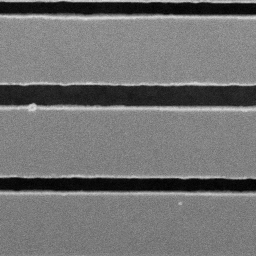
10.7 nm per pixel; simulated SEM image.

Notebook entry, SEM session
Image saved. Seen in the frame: lines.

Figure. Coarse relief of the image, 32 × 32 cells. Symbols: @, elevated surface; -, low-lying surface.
--------------------------------
--------------------------------
@@@@@@@@@@@@@@@@@@@@@@@@@@@@@@@@
@@@@@@@@@@@@@@@@@@@@@@@@@@@@@@@@
@@@@@@@@@@@@@@@@@@@@@@@@@@@@@@@@
@@@@@@@@@@@@@@@@@@@@@@@@@@@@@@@@
@@@@@@@@@@@@@@@@@@@@@@@@@@@@@@@@
@@@@@@@@@@@@@@@@@@@@@@@@@@@@@@@@
@@@@@@@@@@@@@@@@@@@@@@@@@@@@@@@@
@@@@@@@@@@@@@@@@@@@@@@@@@@@@@@@@
@@@@@@@@@@@@@@@@@@@@@@@@@@@@@@@@
--------------------------------
--------------------------------
@@@@@@@@@@@@@@@@@@@@@@@@@@@@@@@@
@@@@@@@@@@@@@@@@@@@@@@@@@@@@@@@@
@@@@@@@@@@@@@@@@@@@@@@@@@@@@@@@@
@@@@@@@@@@@@@@@@@@@@@@@@@@@@@@@@
@@@@@@@@@@@@@@@@@@@@@@@@@@@@@@@@
@@@@@@@@@@@@@@@@@@@@@@@@@@@@@@@@
@@@@@@@@@@@@@@@@@@@@@@@@@@@@@@@@
@@@@@@@@@@@@@@@@@@@@@@@@@@@@@@@@
@@@@@@@@@@@@@@@@@@@@@@@@@@@@@@@@
--------------------------------
--------------------------------
@@@@@@@@@@@@@@@@@@@@@@@@@@@@@@@@
@@@@@@@@@@@@@@@@@@@@@@@@@@@@@@@@
@@@@@@@@@@@@@@@@@@@@@@@@@@@@@@@@
@@@@@@@@@@@@@@@@@@@@@@@@@@@@@@@@
@@@@@@@@@@@@@@@@@@@@@@@@@@@@@@@@
@@@@@@@@@@@@@@@@@@@@@@@@@@@@@@@@
@@@@@@@@@@@@@@@@@@@@@@@@@@@@@@@@
@@@@@@@@@@@@@@@@@@@@@@@@@@@@@@@@